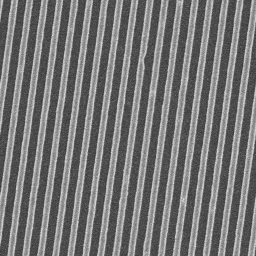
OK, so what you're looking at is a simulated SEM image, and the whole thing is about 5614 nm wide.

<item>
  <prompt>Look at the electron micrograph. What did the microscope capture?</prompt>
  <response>parallel lines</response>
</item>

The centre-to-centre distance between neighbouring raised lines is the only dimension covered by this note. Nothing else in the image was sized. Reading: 327 nanometres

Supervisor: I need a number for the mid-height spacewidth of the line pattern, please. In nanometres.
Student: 193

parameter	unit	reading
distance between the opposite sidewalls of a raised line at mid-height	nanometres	133